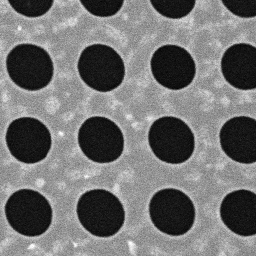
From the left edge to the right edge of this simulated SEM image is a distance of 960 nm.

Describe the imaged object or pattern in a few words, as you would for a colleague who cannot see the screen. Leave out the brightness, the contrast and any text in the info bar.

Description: a regular array of holes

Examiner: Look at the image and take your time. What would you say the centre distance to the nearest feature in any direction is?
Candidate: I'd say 0.267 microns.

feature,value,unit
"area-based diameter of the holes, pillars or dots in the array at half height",175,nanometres